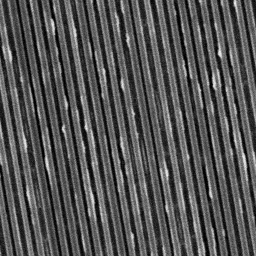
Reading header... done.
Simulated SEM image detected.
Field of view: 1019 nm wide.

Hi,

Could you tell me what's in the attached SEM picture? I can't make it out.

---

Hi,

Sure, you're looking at parallel lines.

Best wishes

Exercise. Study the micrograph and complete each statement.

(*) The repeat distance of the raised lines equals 44.4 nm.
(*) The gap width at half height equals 21.1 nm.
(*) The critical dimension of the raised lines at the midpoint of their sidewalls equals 24.5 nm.